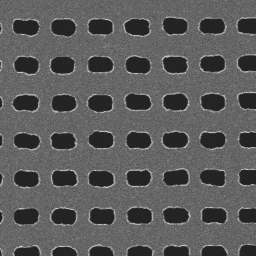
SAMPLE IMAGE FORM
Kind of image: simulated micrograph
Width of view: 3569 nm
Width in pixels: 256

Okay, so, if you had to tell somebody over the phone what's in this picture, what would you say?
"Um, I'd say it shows a regular array of holes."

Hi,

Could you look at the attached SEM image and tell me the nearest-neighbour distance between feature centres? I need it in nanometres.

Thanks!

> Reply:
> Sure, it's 515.